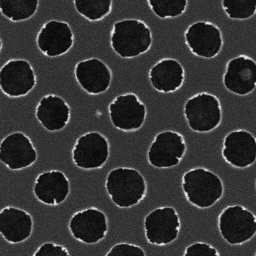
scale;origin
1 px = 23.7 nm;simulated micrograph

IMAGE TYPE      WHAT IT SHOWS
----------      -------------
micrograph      a regular array of holes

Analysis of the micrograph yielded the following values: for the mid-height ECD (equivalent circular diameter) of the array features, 820 nm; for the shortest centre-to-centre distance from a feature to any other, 51.9 px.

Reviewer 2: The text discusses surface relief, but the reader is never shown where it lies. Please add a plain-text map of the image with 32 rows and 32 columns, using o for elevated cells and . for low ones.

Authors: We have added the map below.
.....oooo.....ooooo....ooooo....
....oooooo...oooooo....ooooo....
oooooooooooooooooooooooooooooooo
ooooo....ooooo....oooooo...ooooo
ooooo....ooooo.....oooo.....oooo
ooooo....ooooo.....ooooo....oooo
oooooo..ooooooo...oooooo...ooooo
ooooooooooo.ooooooooooooooooo..o
....oooooo...oooooo....ooooo....
....oooooo....ooooo....ooooo....
....oooooo....ooooo...oooooo....
o..oooooooo.ooooooooooooooooo..o
ooooo...ooooooo..ooooooo...ooooo
ooooo...oooooo....ooooo....ooooo
ooooo....ooooo....ooooo.....oooo
ooooo...oooooo....oooooo...ooooo
ooooooooooooooooooooooooooooo..o
o...oooooo...oooooo....ooooo....
....ooooo....oooooo....ooooo....
....ooooo....oooooo....ooooo....
o...oooooo...oooooo...ooooooo..o
oooooooooooooo...ooooooo..oooooo
ooooo...ooooo.....ooooo....ooooo
oooo.....oooo.....ooooo.....oooo
ooooo...oooooo....oooooo....oooo
ooooooooooooooo..ooooooo..oooooo
...ooooooo..ooooooo...oooooo...o
....ooooo....ooooo....oooooo....
....ooooo....ooooo....oooooo....
o...ooooo....ooooo....oooooo....
oooooooooooooooooooooooooooooooo
ooooo...oooooo....ooooo....ooooo